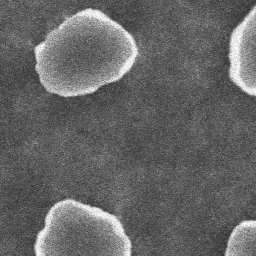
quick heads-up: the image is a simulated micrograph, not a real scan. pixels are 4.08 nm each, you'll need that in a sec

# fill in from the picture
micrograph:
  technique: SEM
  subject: raised bodies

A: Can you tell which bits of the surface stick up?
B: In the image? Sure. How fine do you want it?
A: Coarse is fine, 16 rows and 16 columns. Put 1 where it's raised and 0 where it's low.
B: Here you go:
0000000000000000
0000111000000001
0001111100000001
0011111100000001
0011111100000001
0001110000000001
0000000000000000
0000000000000000
0000000000000000
0000000000000000
0000000000000000
0000000000000000
0000000000000000
0001111000000000
0001111100000001
0011111100000011